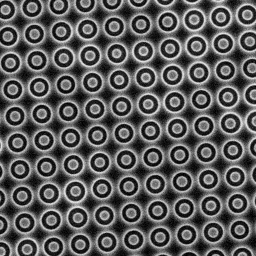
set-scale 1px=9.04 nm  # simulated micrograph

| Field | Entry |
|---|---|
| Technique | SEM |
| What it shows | an array of small figures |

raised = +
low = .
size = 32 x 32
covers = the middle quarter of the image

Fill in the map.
.+++++.+++++++++++++++++++..++++
+++++++++++++++++++...+++....++.
++++++..++++....++.....++.....+.
..+++....++.....++.....++.....++
...++.....+.....++.....++....+++
...++....+++....+++...++++++++++
..++++...+++++++++++++++++++++++
.+++++++++++++++++++++++++...+++
+++++++++++++...+++....++.....++
++++++...+++.....++.....+.....++
...++.....++.....++.....+.....++
....+.....++.....++....+++...+++
...+++....+++...++++..++++++++++
...++++..+++++++++++++++++++++++
+++++++++++++++++++++..+++....++
++++++++.++++....+++....++.....+
...+++....+++....++.....++.....+
....++.....++....++.....++....++
....++.....++....+++...+++++.+++
....+++...++++..++++++++++++++++
...+++++++++++++++++++++++++..++
+++++++++++++++.+++++...+++....+
++++++++..++++...+++.....++....+
+...+++....++.....++.....++....+
.....+.....++.....++....+++...++
.....++....+++...++++..+++++++++
.....++...++++++++++++++++++++++
+..+++++++++++++++++++++++++...+
+++++++++++++++..++++....++.....
++..++++...+++....++.....++.....
+....++.....++.....+.....++.....
.....++.....++....+++....+++...+